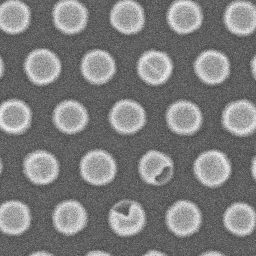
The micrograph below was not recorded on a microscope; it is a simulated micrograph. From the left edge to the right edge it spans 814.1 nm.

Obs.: a regular array of raised bodies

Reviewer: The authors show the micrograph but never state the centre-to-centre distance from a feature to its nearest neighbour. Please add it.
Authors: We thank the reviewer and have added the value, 179 nanometres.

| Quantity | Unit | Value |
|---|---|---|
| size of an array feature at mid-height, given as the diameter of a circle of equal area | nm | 108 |